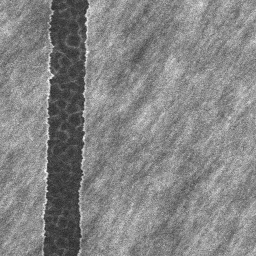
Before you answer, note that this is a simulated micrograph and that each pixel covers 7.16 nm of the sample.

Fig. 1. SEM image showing one or a few lines or trenches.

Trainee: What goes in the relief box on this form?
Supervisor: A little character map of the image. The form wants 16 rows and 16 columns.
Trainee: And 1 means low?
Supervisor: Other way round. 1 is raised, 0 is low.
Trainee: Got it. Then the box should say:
1110011111111111
1110011111111111
1110011111111111
1110011111111111
1110011111111111
1110011111111111
1110011111111111
1110011111111111
1110011111111111
1110011111111111
1110011111111111
1110011111111111
1110011111111111
1110011111111111
1110011111111111
1110011111111111